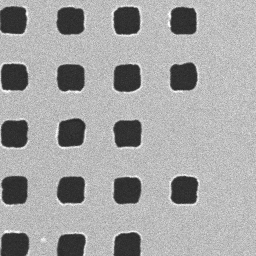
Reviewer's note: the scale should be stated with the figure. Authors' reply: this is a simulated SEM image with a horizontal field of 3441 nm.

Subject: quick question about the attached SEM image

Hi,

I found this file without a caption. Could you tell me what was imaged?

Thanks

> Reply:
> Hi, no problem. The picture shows a regular array of holes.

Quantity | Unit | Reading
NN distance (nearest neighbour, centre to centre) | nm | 754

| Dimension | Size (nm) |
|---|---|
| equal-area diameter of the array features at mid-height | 398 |